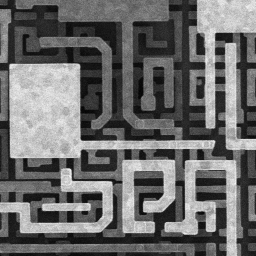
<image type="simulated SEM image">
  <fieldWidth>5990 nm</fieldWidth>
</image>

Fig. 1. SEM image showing wiring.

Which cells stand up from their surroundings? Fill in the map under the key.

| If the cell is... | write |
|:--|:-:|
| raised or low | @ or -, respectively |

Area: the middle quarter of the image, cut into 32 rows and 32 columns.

@@@@------@@---@@---@@@-@@@-----
@@@@------@@---@@---@@---@@-----
@@@@------@@---@@---@@---@@-----
@@@@------@@---@@---@@---@@-----
@@@@------@@---@@---@@---@@-----
@@@@------@@---@@---@@---@@-----
@@@@------@@---@@---@@---@@-----
@@@@------@@---@@---@@---@@-----
@@@@------@@---@@--@@@@--@@-----
@@@@------@@---@@--@@@@--@@-----
@@@@------@@---@@--@@@@--@@-----
@@@@------@@---@@---------------
@@@@------@@---@@@--------------
@@@@----@@@@---@@@@-------------
@@@@---@@@@-----@@@@@@@@@@@-----
@@@@---@@@-------@@@@@@@@@@-----
@@@@----------------------------
@@@@----------------------------
@@@@----------------------------
@@@@@@@@@@@@@@@@@@@@@@@@@@@@@@@@
@@@@@@@@@@@@@@@@@@@@@@@@@@@@@@@@
@@@@----------------------------
@@@@----------------------------
--------------------------------
---------------@@@@@@@@@@@@@--@@
---------------@@@@@@@@@@@@@--@@
@@-------------@@@@@@@@@@@@@--@@
@@-------------@@--------@@@--@@
@@-------------@@--------@@@--@@
@@@@@@@@@@@@---@@--------@@@--@@
@@@@@@@@@@@@---@@--------@@@--@@
@@@@@@@@@@@@---@@--------@@@--@@